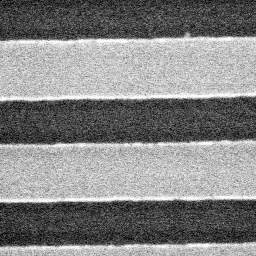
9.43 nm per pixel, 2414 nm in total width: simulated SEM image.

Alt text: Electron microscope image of lines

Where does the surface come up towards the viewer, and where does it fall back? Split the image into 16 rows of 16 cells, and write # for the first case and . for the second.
................
................
.........#######
################
################
################
................
................
................
################
################
################
#######.........
................
................
################